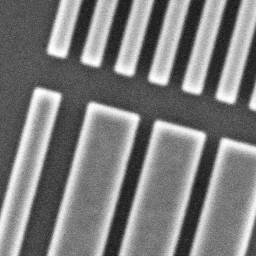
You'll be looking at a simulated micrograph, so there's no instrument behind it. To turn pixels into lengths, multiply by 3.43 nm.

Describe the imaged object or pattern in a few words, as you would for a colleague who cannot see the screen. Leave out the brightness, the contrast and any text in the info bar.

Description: groups of lines, slits or small figures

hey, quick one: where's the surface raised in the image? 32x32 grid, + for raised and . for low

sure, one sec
........++..++...++..+++..++..++
.......+++..++..+++..++..+++..++
.......++...++..++...++..++...++
.......++..+++..++..+++..++..+++
.......++..++...++..++...++..++.
......+++..++..+++..++..+++..++.
......++...++..++...++..++...++.
..........+++..++..+++..++..+++.
...............++..++...++..++..
...................++..+++..++..
.......................++..+++..
....++..................+..+++..
....+++.....................+...
....+++....+++..................
....+++....++++++...............
...++++....++++++...+...........
...+++....+++++++..++++++.......
...+++....+++++++..++++++.......
...+++....++++++...++++++..+++++
..++++...+++++++..+++++++..+++++
..+++....+++++++..+++++++..+++++
..+++....+++++++..++++++...+++++
.++++....++++++...++++++..++++++
.+++....+++++++..+++++++..++++++
.+++....+++++++..+++++++..++++++
.+++....++++++...++++++...++++++
++++....++++++..+++++++..+++++++
+++....+++++++..+++++++..+++++++
+++....+++++++..++++++...++++++.
+++....++++++...++++++...++++++.
+++...+++++++..+++++++..+++++++.
++....+++++++..+++++++..+++++++.